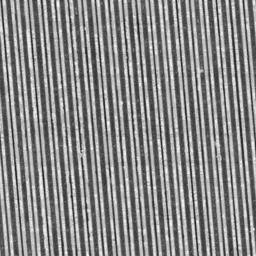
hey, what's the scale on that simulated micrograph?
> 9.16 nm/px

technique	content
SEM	parallel lines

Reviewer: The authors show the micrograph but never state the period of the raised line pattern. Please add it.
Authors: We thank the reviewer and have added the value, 0.0612 microns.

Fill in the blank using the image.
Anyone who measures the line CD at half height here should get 25.1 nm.